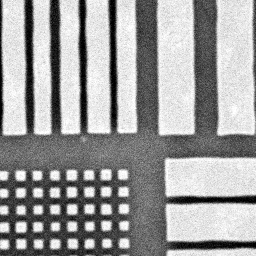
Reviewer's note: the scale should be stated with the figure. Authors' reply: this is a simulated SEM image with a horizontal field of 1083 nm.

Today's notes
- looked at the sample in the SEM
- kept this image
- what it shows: groups of lines, slits or small figures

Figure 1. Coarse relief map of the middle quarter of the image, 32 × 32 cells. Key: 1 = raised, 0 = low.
11110011111001111100000011111111
11110011111001111100000011111111
11110011111000111100000011111111
11110011111000111100000011111111
11110011111000111100000011111111
11110011111000111100000011111111
11110011111000111100000011111111
11110011111000111100000011111111
11110011111000111100000011111111
11110011111000111100000011111111
11110011111000111100000011111111
11110011111000111100000011111111
11110011111000111100000011111111
11110011111000111100000011111111
11110011111000111100000011111111
11110011111000111100000011111111
11110011111000111100000011111111
00000000000000000000000000000000
00000000000000000000000000000000
00000000000000000000000000000000
00000000000000000000000000000000
00000000000000000000000000000000
00000000000000000000000000000000
00000000000000000000000000000000
00000000000000000000000000111111
00000000000000000000000000111111
00000000000000000000000000111111
01100110011000110000000000111111
01100110011000110000000000111111
00000000000000000000000000111111
00000000000000000000000000111111
01100110001000110000000000111111